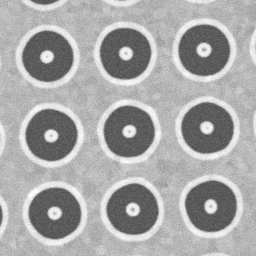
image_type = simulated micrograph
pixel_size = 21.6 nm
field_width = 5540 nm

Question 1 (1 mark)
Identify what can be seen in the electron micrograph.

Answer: an array of small figures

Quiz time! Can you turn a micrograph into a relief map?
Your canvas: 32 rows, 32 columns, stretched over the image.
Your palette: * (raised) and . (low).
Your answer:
****...*************************
********************************
********************************
**************...******.....****
****....*****......***.......***
***......***.......***.......***
**........**...*...***...*...***
**........**.......***.......***
***......****......****.....****
***......****.....******...*****
*****..*************************
********************************
*************************.******
*****...******....*****......***
****.....****......****......***
***.......***.......**........**
***.......***.......**........**
***.......***.......***......***
***.......***......****......***
****.....*****....*******..*****
******.*************************
********************************
*************************...****
*****....*****.....*****.....***
****......***.......***.......**
***.......***.......***.......**
.**........**...*...***.......**
.**.......***.......***.......**
****......****.....*****.....***
*****....******...**************
********************************
********************************